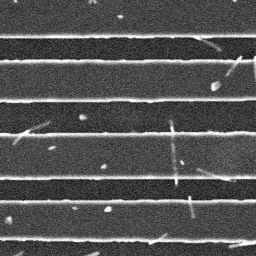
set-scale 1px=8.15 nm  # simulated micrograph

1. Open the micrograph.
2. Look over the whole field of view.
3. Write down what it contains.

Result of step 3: lines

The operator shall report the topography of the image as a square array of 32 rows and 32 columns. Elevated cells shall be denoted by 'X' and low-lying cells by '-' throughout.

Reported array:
XXXXXXXXXXXXXXXXXXXXXXXXXXXXXXXX
XXXXXXXXXXXXXXXXXXXXXXXXXXXXXXXX
XXXXXXXXXXXXXXXXXXXXXXXXXXXXXXXX
XXXXXXXXXXXXXXXXXXXXXXXXXXXXXXXX
XXXXXXXXXXXXXXXXXXXXXXXXXXXXXXXX
--------------------------------
--------------------------------
-----------------------------XXX
XXXXXXXXXXXXXXXXXXXXXXXXXXXXXXXX
XXXXXXXXXXXXXXXXXXXXXXXXXXXXXXXX
XXXXXXXXXXXXXXXXXXXXXXXXXXXXXXXX
XXXXXXXXXXXXXXXXXXXXXXXXXXXXXXXX
XXXXXXXXXXXXXXXXXXXXXXXXXXXXXXX-
--------------------------------
--------------------------------
--------------------------------
--------------------------------
XXXXXXXXXXXXXXXXXXXXXXXXXXXXXXXX
XXXXXXXXXXXXXXXXXXXXXXXXXXXXXXXX
XXXXXXXXXXXXXXXXXXXXXXXXXXXXXXXX
XXXXXXXXXXXXXXXXXXXXXXXXXXXXXXXX
XXXXXXXXXXXXXXXXXXXXXXXXXXXXXXXX
--------------------------------
--------------------------------
--------------------------------
XXXXXXXXXXXXXXXXXXXXXXXXXXXXXXXX
XXXXXXXXXXXXXXXXXXXXXXXXXXXXXXXX
XXXXXXXXXXXXXXXXXXXXXXXXXXXXXXXX
XXXXXXXXXXXXXXXXXXXXXXXXXXXXXXXX
XXXXXXXXXXXXXXXXXXXXXXXXXXXXXXXX
--------------------------------
--------------------------------